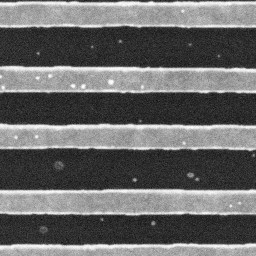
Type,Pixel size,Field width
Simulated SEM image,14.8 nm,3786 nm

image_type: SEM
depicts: lines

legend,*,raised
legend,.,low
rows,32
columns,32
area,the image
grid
*************.******************
********************************
********************************
................................
................................
................................
................................
................................
**************.*................
********************************
********************************
......*........****......*.*.***
................................
................................
................................
................................
********************************
********************************
******...***********************
................................
................................
................................
................................
................................
********************************
********************************
********************************
................................
................................
................................
................................
********************************